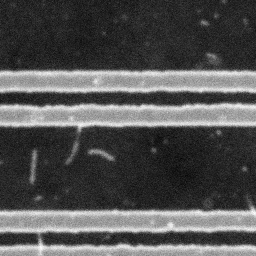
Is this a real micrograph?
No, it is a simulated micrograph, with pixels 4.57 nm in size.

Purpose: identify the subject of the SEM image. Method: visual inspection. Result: lines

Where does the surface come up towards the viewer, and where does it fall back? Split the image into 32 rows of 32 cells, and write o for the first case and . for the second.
................................
................................
................................
................................
................................
................................
................................
................................
................................
oooooooooooooooooooooooooooooooo
oooooooooooooooooooooooooooooooo
................................
................................
oooooooooooooooooooooooooooooooo
oooooooooooooooooooooooooooooooo
oooooooooooooooooooooooooooooooo
................................
................................
................................
................................
................................
................................
................................
................................
................................
................................
ooooooooooooooooooooooooo.oooooo
oooooooooooooooooooooooooooooooo
oooooooooooooooooooooooooooooooo
................................
................................
oooooooooooooooooooooooooooooooo